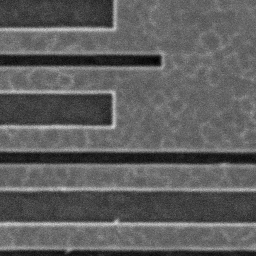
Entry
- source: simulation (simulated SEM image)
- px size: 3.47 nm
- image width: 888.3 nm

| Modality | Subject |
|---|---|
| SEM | parallel lines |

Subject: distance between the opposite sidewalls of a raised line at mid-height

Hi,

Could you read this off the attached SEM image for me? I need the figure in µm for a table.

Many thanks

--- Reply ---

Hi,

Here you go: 0.0873